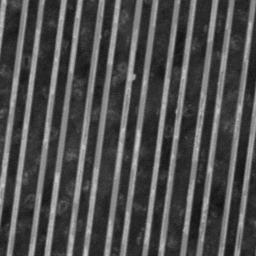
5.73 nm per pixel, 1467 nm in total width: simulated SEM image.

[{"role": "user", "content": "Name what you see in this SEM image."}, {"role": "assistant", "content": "parallel lines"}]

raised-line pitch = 0.108 µm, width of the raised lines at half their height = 28.4 nm